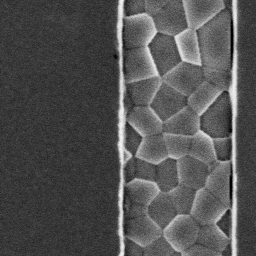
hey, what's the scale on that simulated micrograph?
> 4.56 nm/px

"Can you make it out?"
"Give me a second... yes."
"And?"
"one or a few lines or trenches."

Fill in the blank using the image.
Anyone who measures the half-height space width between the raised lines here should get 0.512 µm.